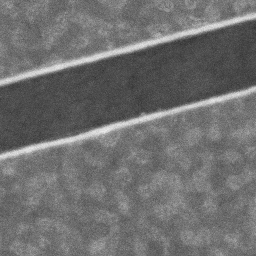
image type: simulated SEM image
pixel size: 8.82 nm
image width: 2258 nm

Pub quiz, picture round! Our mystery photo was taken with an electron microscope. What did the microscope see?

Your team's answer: one or a few lines or trenches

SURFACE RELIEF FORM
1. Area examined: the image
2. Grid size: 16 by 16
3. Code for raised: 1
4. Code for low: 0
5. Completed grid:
1111111111111111
1111111111111100
1111111111000000
1111110000000000
1100000000000000
0000000000000000
0000000000000111
0000000001111111
0000011111111111
0111111111111111
1111111111111111
1111111111111111
1111111111111111
1111111111111111
1111111111111111
1111111111111111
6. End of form